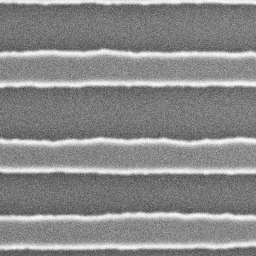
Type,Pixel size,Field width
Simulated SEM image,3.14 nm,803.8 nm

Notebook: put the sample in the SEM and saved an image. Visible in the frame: lines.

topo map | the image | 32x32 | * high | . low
................................
................................
................................
................................
................................
................................
....****....***.................
********************************
********************************
********************************
********************************
................................
................................
................................
................................
................................
................................
...........****..****.......****
********************************
********************************
********************************
..........*.********************
................................
................................
................................
................................
................................
********************************
********************************
********************************
********************************
................................